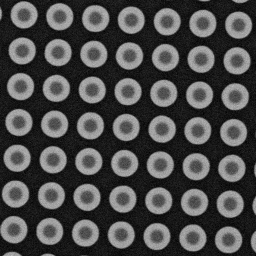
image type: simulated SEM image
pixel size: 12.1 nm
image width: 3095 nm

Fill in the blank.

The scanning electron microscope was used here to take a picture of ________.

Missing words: an array of small figures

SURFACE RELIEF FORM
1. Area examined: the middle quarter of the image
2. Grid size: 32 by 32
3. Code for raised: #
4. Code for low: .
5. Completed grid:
......###.....#####....#####...#
........................###.....
................................
......###.......................
#...######....####.....####.....
#...######...######...######...#
#...######...######...######...#
#...######...######...######...#
....######...######...######...#
......##......####....######...#
........................##......
................................
.....###........................
#...#####....#####.....###......
#..#######...######...#####....#
#..#######..#######..#######..##
#..#######..#######..#######..##
....#####....#####...#######..##
.....###.....#####....#####....#
.......................##.......
................................
.....###........................
...######....####.....####......
#..######...######...######...##
#..######...######...######...##
...######...######...######...##
....#####...######...######...##
.....##......####.....#####...##
........................#......#
................................
....####........................
...######...#####.....####.....#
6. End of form